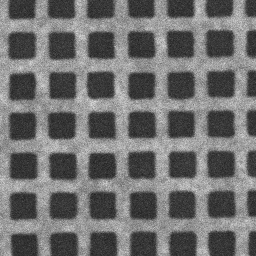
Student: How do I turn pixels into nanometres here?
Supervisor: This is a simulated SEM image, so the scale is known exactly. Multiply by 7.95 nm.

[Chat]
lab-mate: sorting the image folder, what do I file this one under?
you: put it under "a regular array of holes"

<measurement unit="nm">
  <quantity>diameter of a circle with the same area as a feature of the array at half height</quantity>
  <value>242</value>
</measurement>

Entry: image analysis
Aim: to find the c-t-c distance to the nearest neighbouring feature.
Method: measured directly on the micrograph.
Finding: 312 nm